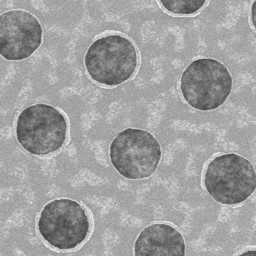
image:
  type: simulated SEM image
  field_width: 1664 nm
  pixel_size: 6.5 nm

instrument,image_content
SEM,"holes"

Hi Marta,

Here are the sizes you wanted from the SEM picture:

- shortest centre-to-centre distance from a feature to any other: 630 nm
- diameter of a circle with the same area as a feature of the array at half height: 333 nm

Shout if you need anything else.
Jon